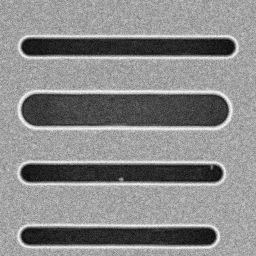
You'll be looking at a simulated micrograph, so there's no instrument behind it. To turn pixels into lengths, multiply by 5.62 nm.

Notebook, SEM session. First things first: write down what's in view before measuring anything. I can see groups of lines, slits or small figures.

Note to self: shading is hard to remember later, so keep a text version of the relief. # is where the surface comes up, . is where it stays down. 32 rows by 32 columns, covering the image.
################################
################################
################################
################################
################################
###..........................###
###..........................###
################################
################################
################################
################################
################################
###.........................####
###..........................###
###..........................###
####........................####
################################
################################
################################
################################
####.......................#####
###.........................####
###.........................####
################################
################################
################################
################################
################################
###.......................######
###........................#####
###........................#####
################################